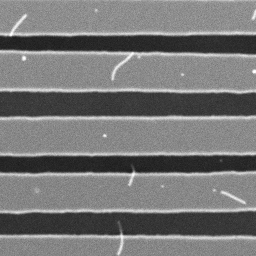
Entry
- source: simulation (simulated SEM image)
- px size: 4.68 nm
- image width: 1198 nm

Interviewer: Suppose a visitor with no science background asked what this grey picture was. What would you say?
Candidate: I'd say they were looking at lines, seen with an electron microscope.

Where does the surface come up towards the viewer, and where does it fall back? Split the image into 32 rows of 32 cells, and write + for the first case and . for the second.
++++++++++++++++++++++++++++++++
++++++++++++++++++++++++++++++++
++++++++++++++++++++++++++++++++
++++++++++++++++++++++++++++++++
................................
................................
+++++++++++++++++..+............
++++++++++++++++++++++++++++++++
++++++++++++++++++++++++++++++++
++++++++++++++++++++++++++++++++
++++++++++++++++++++++++++++++++
......................+......++.
................................
................................
................................
++++++++++++++++++++++++++++++++
++++++++++++++++++++++++++++++++
++++++++++++++++++++++++++++++++
++++++++++++++++++++++++++++++++
................................
................................
...........................+++++
++++++++++++++++++++++++++++++++
++++++++++++++++++++++++++++++++
++++++++++++++++++++++++++++++++
++++++++++++++++++++++++++++++++
+++++++++++++++++++++++...++....
................................
................................
+++++++++++++++++++++++......++.
++++++++++++++++++++++++++++++++
++++++++++++++++++++++++++++++++